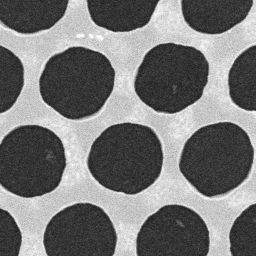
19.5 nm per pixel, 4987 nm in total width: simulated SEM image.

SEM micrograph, holes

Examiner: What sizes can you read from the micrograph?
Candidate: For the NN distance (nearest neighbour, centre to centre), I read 90.3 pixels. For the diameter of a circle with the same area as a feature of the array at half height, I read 1.44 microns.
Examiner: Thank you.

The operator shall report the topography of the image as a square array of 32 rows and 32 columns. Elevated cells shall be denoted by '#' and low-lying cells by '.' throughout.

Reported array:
.........##.........###.........
........###........####........#
.......####........####........#
#.....#######....#######.....###
################################
####################..##########
..######....######.......#####..
...###........####........###...
...###........###.........###...
...##.........###.........##....
...##.........###.........##....
...##.........###........####...
..###........#####.......####...
.######......######....#######..
########....####################
##############....########...###
#......######......#####.......#
........####........###........#
........###.........###.........
........###.........##..........
........###.........##..........
........###.........###........#
........####........###........#
.......######.....######......##
##...#####################.#####
#########...#########.##########
.######......######......#####..
..####........####.......####...
..####........####........###...
...##..........##.........###...
...##..........##.........###...
..####........###.........###...